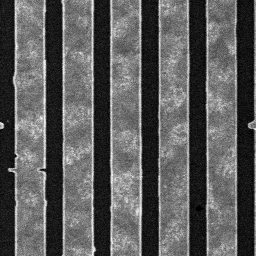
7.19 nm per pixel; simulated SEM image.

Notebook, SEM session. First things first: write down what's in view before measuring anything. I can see parallel lines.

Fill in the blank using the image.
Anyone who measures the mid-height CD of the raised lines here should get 205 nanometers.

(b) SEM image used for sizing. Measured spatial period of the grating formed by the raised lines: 344 nanometres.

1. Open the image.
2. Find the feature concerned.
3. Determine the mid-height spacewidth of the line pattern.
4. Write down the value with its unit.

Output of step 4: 138 nm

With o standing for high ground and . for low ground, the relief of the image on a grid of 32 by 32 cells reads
..oooo..oooo..ooo...ooo...ooo...
..ooo...oooo..ooo...ooo...ooo...
..ooo...oooo..ooo...ooo...ooo...
..ooo...oooo..ooo...ooo...ooo...
..ooo...oooo..ooo...ooo...ooo...
..ooo...oooo..ooo...ooo...ooo...
..ooo...ooo...ooo...ooo...ooo...
..ooo...ooo...ooo...oooo..ooo...
..ooo...ooo...ooo...oooo..ooo...
..ooo...oooo..ooo...ooo...ooo...
..oooo..oooo..ooo...ooo...ooo...
..oooo..oooo..ooo...ooo...ooo...
..oooo..oooo..ooo...ooo...ooo...
..oooo..oooo..ooo...ooo...ooo...
..oooo..oooo..ooo...ooo...ooo...
..oooo..oooo..ooo...ooo...ooo..o
..oooo..oooo..ooo...ooo...ooo...
..oooo..oooo..oooo..ooo...ooo...
..oooo..oooo..oooo..ooo...ooo...
..oooo..oooo..oooo..ooo...ooo...
..ooo...oooo..oooo..ooo...ooo...
..ooo...oooo..oooo..ooo...ooo...
..ooo...oooo..oooo..ooo...ooo...
..ooo...ooo...oooo..ooo...ooo...
..ooo...ooo...oooo..ooo...ooo...
..oooo..ooo...oooo..ooo...ooo...
..ooo...ooo...oooo..ooo...ooo...
..ooo...ooo...oooo..ooo...ooo...
..ooo...oooo..oooo..ooo...ooo...
..ooo...oooo..oooo..ooo...ooo...
..oooo..oooo..oooo..ooo...ooo...
..oooo..oooo..oooo..ooo...ooo...